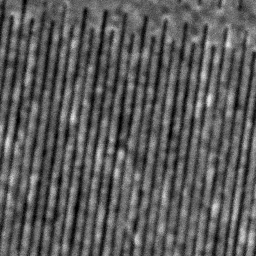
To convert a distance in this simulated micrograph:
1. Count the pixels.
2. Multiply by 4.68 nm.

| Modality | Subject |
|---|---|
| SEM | parallel lines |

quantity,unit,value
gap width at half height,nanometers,12.7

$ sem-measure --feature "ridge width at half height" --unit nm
33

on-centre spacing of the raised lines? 10.2 px